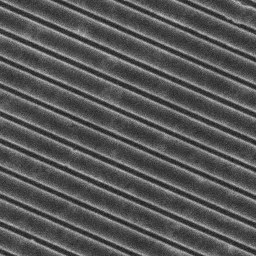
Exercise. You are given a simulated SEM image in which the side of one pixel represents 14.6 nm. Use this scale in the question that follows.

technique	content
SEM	parallel lines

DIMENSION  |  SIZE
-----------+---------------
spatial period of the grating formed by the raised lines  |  368 nanometers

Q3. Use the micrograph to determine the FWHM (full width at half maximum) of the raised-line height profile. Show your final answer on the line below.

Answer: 0.289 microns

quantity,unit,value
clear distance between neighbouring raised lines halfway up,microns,0.0785